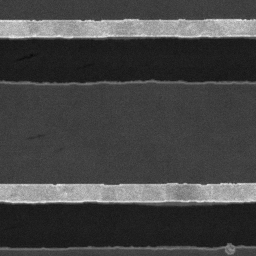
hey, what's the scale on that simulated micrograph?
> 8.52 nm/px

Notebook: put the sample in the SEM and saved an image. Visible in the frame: lines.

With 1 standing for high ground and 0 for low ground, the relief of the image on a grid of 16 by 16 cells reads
1111111111111111
1111111111111111
0000000000000000
0000000000000000
0000000000000000
1111111111111111
1111111111111111
1111111111111111
1111111111111111
1111111111111111
1111111111111111
1111111111111111
1111111111111111
0000000000000000
0000000000000000
0000011110010011